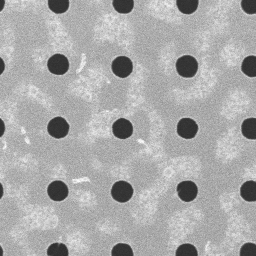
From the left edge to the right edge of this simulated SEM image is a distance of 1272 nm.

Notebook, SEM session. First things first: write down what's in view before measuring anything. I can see a regular array of holes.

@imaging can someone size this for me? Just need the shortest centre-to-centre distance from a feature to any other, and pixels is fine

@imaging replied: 62.6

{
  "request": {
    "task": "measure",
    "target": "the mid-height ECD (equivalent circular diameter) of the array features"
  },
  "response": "107 nanometres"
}